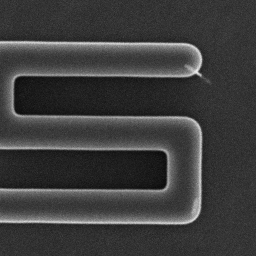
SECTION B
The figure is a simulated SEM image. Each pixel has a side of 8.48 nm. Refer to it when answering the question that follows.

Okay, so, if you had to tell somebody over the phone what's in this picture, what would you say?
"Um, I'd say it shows groups of lines, slits or small figures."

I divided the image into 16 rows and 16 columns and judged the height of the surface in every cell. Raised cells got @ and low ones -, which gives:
----------------
----------------
----------------
@@@@@@@@@@@@----
@@@@@@@@@@@@----
@---------------
@---------------
@@@@@@@@@@@@----
@@@@@@@@@@@@@---
----------@@@---
-----------@----
----------@@----
@@@@@@@@@@@@----
@@@@@@@@@@@@----
----------------
----------------